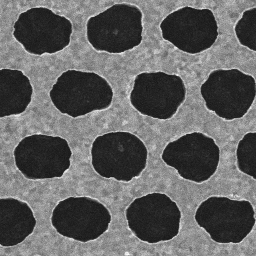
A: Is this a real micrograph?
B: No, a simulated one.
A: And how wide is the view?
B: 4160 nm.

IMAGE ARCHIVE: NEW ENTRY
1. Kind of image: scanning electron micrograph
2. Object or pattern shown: a regular array of holes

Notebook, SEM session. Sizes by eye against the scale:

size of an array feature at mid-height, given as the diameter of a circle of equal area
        842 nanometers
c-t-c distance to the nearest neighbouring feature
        1180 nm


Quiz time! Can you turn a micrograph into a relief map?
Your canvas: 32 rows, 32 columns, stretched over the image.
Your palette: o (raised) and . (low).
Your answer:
oooooooooooooooooooooooooooooooo
ooo....oooooo.....oooo....ooooo.
oo......ooo.......oo.......ooo..
oo.......oo.......oo.......oo...
oo.......oo.......oo.......ooo..
ooo.....ooo......ooooo.....ooo..
oooo...ooooooo.oooooooo..ooooooo
oooooooooooooooooooooooooooooooo
oooooooooooooooooooooooooooooooo
...oooo.....ooooo.....oooo.....o
....ooo.......ooo......oo.......
....oo........oo.......oo.......
....oo........oo.......oo.......
...oooo......oooo.....oooo.....o
.oooooooo.ooooooooo...ooooo...oo
oooooooooooooooooooooooooooooooo
oooooooooooooo..oooooooooooooooo
ooo.....oooo......oooo.....ooo..
oo.......oo.......ooo......ooo..
oo.......oo.......oo.......ooo..
oo.......ooo......ooo......ooo..
ooo.....oooo......oooo.....ooo..
ooooooooooooooo.oooooooo..oooooo
oooooooooooooooooooooooooooooooo
oooooooooooooooooo...ooooooooooo
...oooo......ooo......ooo......o
....ooo.......oo.......oo.......
....oo........oo.......oo.......
....ooo......ooo......ooo.......
....oooo....ooooo.....oooo.....o
..oooooooooooooooooooooooooooooo
oooooooooooooooooooooooooooooooo